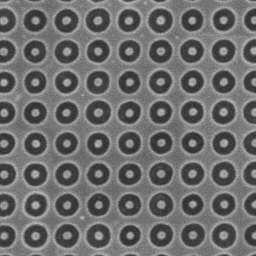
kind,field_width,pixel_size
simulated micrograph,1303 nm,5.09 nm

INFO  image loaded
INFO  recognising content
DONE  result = a regular array of ring-shaped grooves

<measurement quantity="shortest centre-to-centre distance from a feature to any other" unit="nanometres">155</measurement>